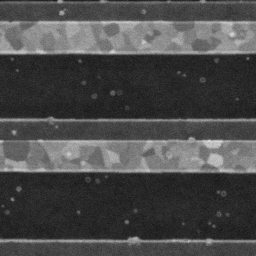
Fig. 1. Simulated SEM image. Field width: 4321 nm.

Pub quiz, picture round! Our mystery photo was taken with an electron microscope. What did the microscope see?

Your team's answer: lines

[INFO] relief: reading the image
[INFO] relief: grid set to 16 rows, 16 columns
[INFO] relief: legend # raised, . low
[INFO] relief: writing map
################
################
################
................
................
................
................
..##.......#....
################
################
################
................
................
................
................
################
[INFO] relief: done